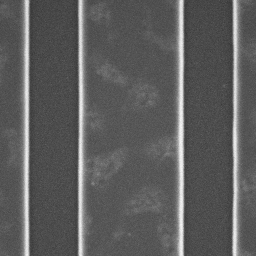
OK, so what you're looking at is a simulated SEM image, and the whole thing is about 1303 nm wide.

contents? one or a few lines or trenches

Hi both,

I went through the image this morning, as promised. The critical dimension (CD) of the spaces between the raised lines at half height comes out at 270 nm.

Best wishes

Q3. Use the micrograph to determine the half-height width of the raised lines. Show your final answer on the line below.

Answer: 518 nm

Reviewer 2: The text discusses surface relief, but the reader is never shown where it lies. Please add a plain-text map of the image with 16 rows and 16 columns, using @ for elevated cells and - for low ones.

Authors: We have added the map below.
@@---@@@@@@----@
@@---@@@@@@----@
@@---@@@@@@----@
@@---@@@@@@----@
@@---@@@@@@----@
@@---@@@@@@----@
@@---@@@@@@----@
@@---@@@@@@----@
@@---@@@@@@----@
@@---@@@@@@----@
@@---@@@@@@----@
@@---@@@@@@----@
@@---@@@@@@----@
@@---@@@@@@----@
@@---@@@@@@----@
@@---@@@@@@----@